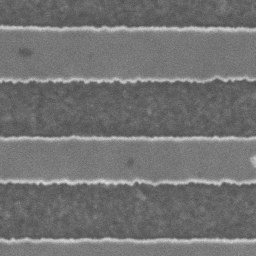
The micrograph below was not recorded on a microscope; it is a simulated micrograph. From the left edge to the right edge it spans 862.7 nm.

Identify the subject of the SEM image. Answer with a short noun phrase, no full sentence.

lines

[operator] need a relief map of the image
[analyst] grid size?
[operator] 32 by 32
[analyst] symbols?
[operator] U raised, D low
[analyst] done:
DDDDDDDDDDDDDDDDDDDDDDDDDDDDDDDD
DDDDDDDDDDDDDDDDDDDDDDDDDDDDDDDD
DDDDDDDDDDDDDDDDDDDDDDDDDDDDDDDD
UUUUUUUDUUUUUUUUUUUUUUDUUDUUUDUD
UUUUUUUUUUUUUUUUUUUUUUUUUUUUUUUU
UUUUUUUUUUUUUUUUUUUUUUUUUUUUUUUU
UUUUUUUUUUUUUUUUUUUUUUUUUUUUUUUU
UUUUUUUUUUUUUUUUUUUUUUUUUUUUUUUU
UUUUUUUUUUUUUUUUUUUUUUUUUUUUUUUU
UUUUUUUUUUUUUUUUUUUUUUUUUUUUUUUU
DDDDDDDDDDDDDDDDDDDDDDDDDDDDDDDD
DDDDDDDDDDDDDDDDDDDDDDDDDDDDDDDD
DDDDDDDDDDDDDDDDDDDDDDDDDDDDDDDD
DDDDDDDDDDDDDDDDDDDDDDDDDDDDDDDD
DDDDDDDDDDDDDDDDDDDDDDDDDDDDDDDD
DDDDDDDDDDDDDDDDDDDDDDDDDDDDDDDD
DDDDDDDDDDDDDDDDDDDDDDDDDDDDDDDD
UUUUUUUUUUUUUUUUUUUUUUUUUUUUUUUU
UUUUUUUUUUUUUUUUUUUUUUUUUUUUUUUU
UUUUUUUUUUUUUUUUUUUUUUUUUUUUUUUU
UUUUUUUUUUUUUUUUUUUUUUUUUUUUUUUU
UUUUUUUUUUUUUUUUUUUUUUUUUUUUUUUU
UUUUUUUUUUUUUUUUUUUUUUUUUUUUUUUU
DDDDDDDDDDDDDDDDDDDDDDDDDDDDDDDD
DDDDDDDDDDDDDDDDDDDDDDDDDDDDDDDD
DDDDDDDDDDDDDDDDDDDDDDDDDDDDDDDD
DDDDDDDDDDDDDDDDDDDDDDDDDDDDDDDD
DDDDDDDDDDDDDDDDDDDDDDDDDDDDDDDD
DDDDDDDDDDDDDDDDDDDDDDDDDDDDDDDD
DDDDDDDDDDDDDDDDDDDDDDDDDDDDDDDD
UUUUUUUUUUUUUUUUUUUUUUUUUUUUUUUU
UUUUUUUUUUUUUUUUUUUUUUUUUUUUUUUU